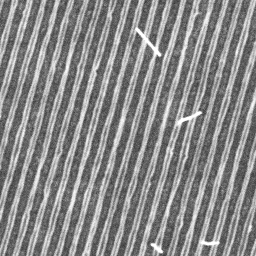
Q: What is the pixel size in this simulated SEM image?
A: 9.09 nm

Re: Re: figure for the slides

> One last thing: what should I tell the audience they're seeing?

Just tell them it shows parallel lines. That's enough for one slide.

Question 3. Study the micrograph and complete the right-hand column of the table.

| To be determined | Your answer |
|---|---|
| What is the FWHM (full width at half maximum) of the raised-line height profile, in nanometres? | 41.6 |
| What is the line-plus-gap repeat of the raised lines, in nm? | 123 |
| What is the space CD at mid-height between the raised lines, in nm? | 83.2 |